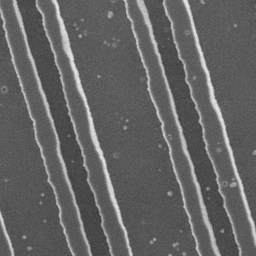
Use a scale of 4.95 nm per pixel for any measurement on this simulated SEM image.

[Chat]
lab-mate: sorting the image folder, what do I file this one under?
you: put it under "lines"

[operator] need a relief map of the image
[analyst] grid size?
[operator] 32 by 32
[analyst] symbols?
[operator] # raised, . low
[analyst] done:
##...##.........##..###.........
##...##.........##...###........
###..###........###..###........
.##...##.........##..###........
.##...##.........##...###.......
.##...##.........##...###.......
.###...##........###..###.......
..##...##.........##...##.......
..##...##.........##...###......
..###...##........###..###......
...##...##.........##..###......
...##...##.........##...###.....
...###..###........###..###.....
...###..###........###...##.....
....##...##.........##...###....
....###..##.........##...###....
....###..###........###..###....
.....##...##.........##..###....
.....##...##.........##...###...
.....###..###........###..###...
......##...##.........##...##...
......##...##.........##...###..
......###..###........###..###..
.......##..###.........##..###..
.......##...##.........##...###.
.......###..###........##...###.
.......###..###........###..###.
.......###...##.........##...##.
#.......##...###........##...###
#.......###..###........###..###
#.......###..###.........##...##
##.......##...##.........##...##